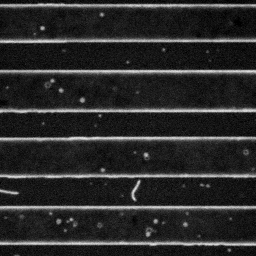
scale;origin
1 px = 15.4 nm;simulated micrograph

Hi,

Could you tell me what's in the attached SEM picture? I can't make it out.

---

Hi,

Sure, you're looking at lines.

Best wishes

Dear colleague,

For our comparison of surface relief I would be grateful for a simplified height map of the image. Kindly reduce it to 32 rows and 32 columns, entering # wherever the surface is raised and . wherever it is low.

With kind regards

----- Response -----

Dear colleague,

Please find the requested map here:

................................
################################
################################
################################
################################
................................
................................
................................
................................
################################
################################
################################
################################
################################
................................
................................
................................
################################
################################
################################
################################
################################
................................
................................
................................
................................
################################
################################
################################
################################
..............................#.
................................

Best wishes